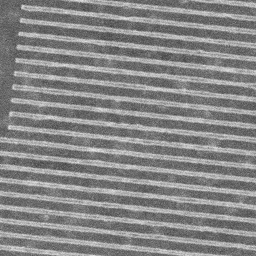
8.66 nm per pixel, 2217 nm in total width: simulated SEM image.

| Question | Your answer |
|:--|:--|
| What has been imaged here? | parallel lines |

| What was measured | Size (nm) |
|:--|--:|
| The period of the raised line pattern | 116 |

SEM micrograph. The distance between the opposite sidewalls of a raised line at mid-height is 32.3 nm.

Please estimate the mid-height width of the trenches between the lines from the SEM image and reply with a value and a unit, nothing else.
82.9 nm